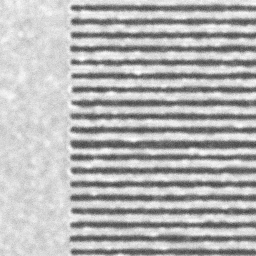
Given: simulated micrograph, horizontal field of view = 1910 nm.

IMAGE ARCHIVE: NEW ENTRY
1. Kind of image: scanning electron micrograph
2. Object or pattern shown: parallel lines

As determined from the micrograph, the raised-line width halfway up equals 47.6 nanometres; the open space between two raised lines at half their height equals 7.25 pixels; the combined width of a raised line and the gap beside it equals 0.101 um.